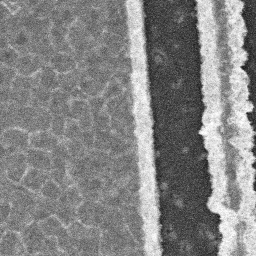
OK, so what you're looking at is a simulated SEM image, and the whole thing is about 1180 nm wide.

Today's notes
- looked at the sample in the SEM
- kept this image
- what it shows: one or a few lines or trenches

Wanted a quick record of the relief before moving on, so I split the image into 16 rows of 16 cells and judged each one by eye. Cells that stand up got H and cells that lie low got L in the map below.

HHHHHHHHLLLLLHHL
HHHHHHHHLLLLLHHL
HHHHHHHHHLLLLHHL
HHHHHHHHHLLLLHHL
HHHHHHHHHLLLLHHL
HHHHHHHHHLLLLHHL
HHHHHHHHHLLLLHHL
HHHHHHHHHLLLLHHL
HHHHHHHHHLLLLHHL
HHHHHHHHHLLLLHHL
HHHHHHHHHLLLLLHL
HHHHHHHHHLLLLLHL
HHHHHHHHHLLLLLHH
HHHHHHHHHLLLLLHH
HHHHHHHHHLLLLLHH
HHHHHHHHHHLLLLHH